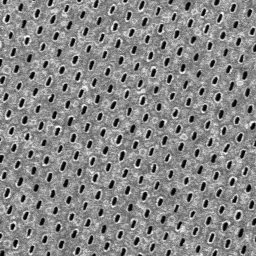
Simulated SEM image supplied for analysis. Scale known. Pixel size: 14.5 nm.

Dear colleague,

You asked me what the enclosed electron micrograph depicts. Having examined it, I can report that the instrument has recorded a regular array of holes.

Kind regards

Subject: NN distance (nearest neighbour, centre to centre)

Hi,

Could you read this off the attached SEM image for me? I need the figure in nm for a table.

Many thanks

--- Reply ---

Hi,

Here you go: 244